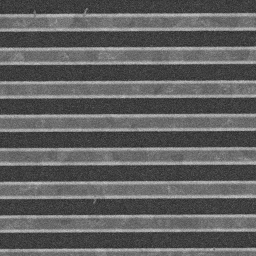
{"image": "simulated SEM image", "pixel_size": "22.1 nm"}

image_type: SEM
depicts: parallel lines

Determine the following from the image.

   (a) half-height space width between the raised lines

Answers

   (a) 444 nm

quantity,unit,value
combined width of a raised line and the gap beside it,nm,740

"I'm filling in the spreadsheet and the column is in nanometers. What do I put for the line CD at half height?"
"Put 309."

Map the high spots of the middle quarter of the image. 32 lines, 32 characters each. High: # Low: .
................................
................................
................................
................................
................................
################################
################################
################################
................................
................................
................................
................................
................................
################################
################################
################################
................................
................................
................................
................................
................................
.............................###
################################
################################
################################
................................
................................
................................
................................
................................
################################
################################